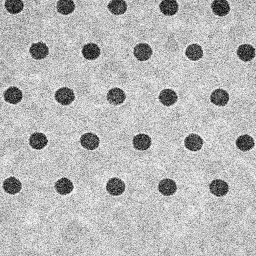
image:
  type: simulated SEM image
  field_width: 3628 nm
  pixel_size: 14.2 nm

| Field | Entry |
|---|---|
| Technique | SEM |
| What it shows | a regular array of holes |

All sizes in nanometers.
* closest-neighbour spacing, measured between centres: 731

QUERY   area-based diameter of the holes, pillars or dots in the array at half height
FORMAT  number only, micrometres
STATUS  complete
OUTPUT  0.276